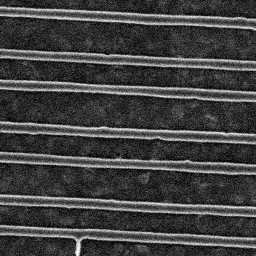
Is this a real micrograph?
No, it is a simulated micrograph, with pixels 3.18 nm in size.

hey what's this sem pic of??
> parallel lines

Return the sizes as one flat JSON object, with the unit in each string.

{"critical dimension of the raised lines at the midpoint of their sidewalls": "28.6 nanometres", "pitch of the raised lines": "116 nm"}